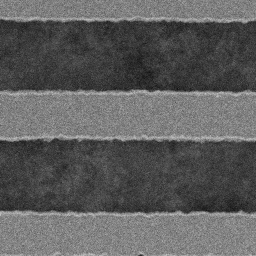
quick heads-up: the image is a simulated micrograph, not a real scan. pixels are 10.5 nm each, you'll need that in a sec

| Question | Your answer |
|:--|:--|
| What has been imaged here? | one or a few lines or trenches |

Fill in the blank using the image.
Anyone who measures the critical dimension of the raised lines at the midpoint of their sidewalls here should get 44.1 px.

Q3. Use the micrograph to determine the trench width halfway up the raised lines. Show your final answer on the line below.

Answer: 0.789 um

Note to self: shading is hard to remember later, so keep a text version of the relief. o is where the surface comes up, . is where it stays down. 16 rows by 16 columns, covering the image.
oooooooooooooooo
................
................
................
................
................
oooooooooooooooo
oooooooooooooooo
oooooooooooooooo
................
................
................
................
oooooooooooooooo
oooooooooooooooo
oooooooooooooooo